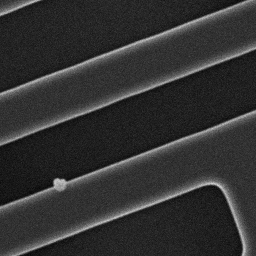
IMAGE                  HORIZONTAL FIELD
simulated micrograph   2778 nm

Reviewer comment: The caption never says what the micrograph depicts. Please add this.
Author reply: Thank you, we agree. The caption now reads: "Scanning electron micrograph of groups of lines, slits or small figures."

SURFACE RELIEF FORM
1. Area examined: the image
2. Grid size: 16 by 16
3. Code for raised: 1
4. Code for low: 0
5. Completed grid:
1000000000000011
0000000000001111
0000000001111111
0000001111111110
0000111111110000
0111111110000000
1111111000000000
1111000000000011
1100000000001111
0000000001111111
0000000111111111
0001111111111111
0111111111000011
1111111100000001
1111100000000001
1100000000000001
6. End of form